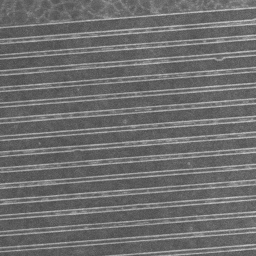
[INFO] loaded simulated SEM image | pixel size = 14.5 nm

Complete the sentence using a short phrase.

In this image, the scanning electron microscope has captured parallel lines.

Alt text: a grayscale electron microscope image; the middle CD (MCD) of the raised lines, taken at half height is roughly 67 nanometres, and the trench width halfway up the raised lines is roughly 167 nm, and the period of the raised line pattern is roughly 232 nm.